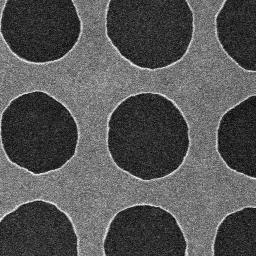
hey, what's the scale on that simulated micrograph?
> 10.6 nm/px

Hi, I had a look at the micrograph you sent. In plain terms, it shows holes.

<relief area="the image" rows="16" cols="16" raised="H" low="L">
LLLLLHHLLLLLHHLL
LLLLLHHLLLLLHHLL
LLLLLHHLLLLLHHLL
HLLLHHHHLLLHHHLL
HHHHHHHHHHHHHHHH
HHHHHHHHHHHHHHHH
HLLLHHHHLLLHHHHL
LLLLLHHLLLLLHHLL
LLLLLHHLLLLLHHLL
LLLLLHHLLLLLHHLL
HLLLHHHHLLLHHHLL
HHHHHHHHHHHHHHHH
HHHHHHHHHHHHHHHH
LLLLHHHLLLLHHHLL
LLLLLHHLLLLHHHLL
LLLLLHHLLLLLHLLL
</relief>